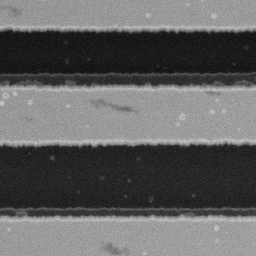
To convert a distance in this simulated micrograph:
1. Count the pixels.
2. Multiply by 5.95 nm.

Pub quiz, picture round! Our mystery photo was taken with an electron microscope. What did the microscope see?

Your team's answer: lines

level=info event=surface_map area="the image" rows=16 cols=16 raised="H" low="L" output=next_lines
HHHHHHHHHHHHHHHH
HHHHHHHHHHHHHHHH
LLLLLLLLLLLLLLLL
LLLLLLLLLLLLLLLL
LLLLLLLLLLLLLLLL
HHHHHHHHHHHHHHHH
HHHHHHHHHHHHHHHH
HHHHHHHHHHHHHHHH
HHHHHHHHHHHHHHHH
LLLLLLLLLLLLLLLL
LLLLLLLLLLLLLLLL
LLLLLLLLLLLLLLLL
LLLLLLLLLLLLLLLL
LLLLLLLLLLLLLLLL
HHHHHHHHHHHHHHHH
HHHHHHHHHHHHHHHH